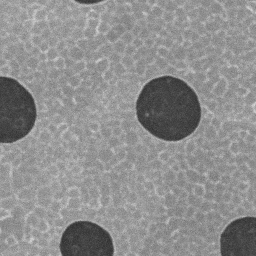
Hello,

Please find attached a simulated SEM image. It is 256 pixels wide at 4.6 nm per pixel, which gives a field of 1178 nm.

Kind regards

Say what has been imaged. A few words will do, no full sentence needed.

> holes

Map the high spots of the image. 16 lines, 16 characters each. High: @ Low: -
@@@@@@@@@@@@@@@@
@@@@@@@@@@@@@@@@
@@@@@@@@@@@@@@@@
@@@@@@@@@@@@@@@@
@@@@@@@@@@@@@@@@
--@@@@@@@---@@@@
--@@@@@@@---@@@@
--@@@@@@@---@@@@
--@@@@@@@@--@@@@
@@@@@@@@@@@@@@@@
@@@@@@@@@@@@@@@@
@@@@@@@@@@@@@@@@
@@@@@@@@@@@@@@@@
@@@@@@@@@@@@@@@@
@@@@---@@@@@@@--
@@@@---@@@@@@@--